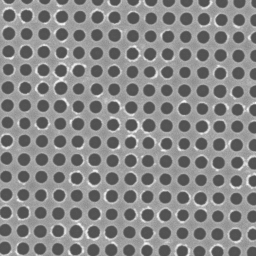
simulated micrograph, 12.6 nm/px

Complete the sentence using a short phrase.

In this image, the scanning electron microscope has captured a regular array of holes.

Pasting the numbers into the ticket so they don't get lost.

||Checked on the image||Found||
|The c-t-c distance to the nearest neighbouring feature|0.22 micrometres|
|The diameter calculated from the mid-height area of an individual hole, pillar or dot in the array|158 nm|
